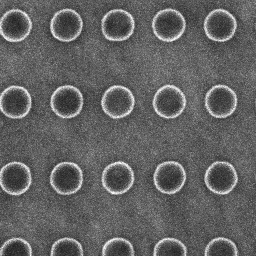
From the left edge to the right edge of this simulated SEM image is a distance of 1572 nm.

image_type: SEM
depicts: a regular array of raised bodies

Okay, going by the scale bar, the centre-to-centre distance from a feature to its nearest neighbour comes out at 316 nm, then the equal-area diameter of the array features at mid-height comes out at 194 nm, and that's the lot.